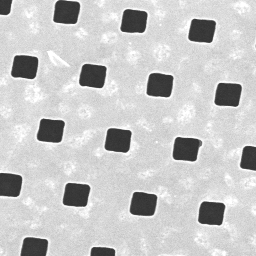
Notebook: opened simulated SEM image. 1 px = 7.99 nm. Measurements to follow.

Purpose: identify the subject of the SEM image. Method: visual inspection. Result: a regular array of holes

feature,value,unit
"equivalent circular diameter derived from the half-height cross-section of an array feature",212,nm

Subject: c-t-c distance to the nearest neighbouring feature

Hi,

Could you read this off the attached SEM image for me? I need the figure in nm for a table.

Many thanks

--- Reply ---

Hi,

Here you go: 544